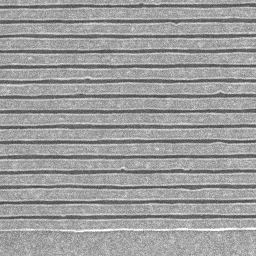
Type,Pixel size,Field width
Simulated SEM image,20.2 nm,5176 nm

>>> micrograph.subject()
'parallel lines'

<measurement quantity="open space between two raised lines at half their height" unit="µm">0.0885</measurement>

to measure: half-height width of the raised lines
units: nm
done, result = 230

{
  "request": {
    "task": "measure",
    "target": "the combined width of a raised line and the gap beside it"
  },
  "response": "305 nanometres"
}